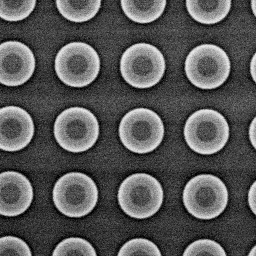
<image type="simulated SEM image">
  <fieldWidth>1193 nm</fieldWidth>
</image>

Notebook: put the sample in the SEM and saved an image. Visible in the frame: an array of small figures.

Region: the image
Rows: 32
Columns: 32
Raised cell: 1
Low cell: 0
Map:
11110001111100011111100111111001
11110000111100001111000011111000
01000000011000000110000001110000
00000000000000000000000000000000
00000000000000000000000000000000
11100000011000000100000000000000
11110001111100001111000011110000
11110001111100011111000111111000
11110001111100011111100111111001
11110001111100011111000111110000
11100000111000001110000011110000
00000000000000000000000000000000
00000000000000000000000000000000
11000000010000000000000000000000
11110001111100001111000011110000
11110001111100011111000111110001
11110001111100011111000111111001
11110001111100011111000111110001
11100000111000001110000011110000
00000000000000000000000000000000
00000000000000000000000000000000
00000000000000000000000000000000
11100001111000001110000011100000
11110001111100011111000111110001
11110001111100011111000111110001
11110001111100011111000111110001
11100000111000001110000011110000
00000000000000000000000000000000
00000000000000000000000000000000
00000000000000000000000000000000
11100001111000001110000011100000
11110001111100011111000111110001